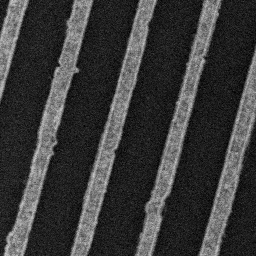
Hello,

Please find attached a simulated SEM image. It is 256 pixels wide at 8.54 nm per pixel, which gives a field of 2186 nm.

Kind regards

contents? one or a few lines or trenches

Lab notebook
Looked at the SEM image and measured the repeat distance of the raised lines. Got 531 nanometres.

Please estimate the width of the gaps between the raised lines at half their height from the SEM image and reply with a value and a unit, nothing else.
418 nanometres